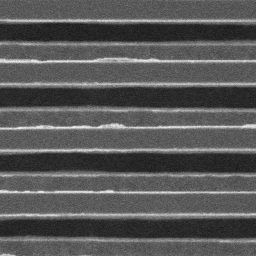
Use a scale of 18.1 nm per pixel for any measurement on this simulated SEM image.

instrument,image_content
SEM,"lines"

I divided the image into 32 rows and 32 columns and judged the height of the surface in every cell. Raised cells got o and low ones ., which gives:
oooooooooooooooooooooooooooooooo
oooooooooooooooooooooooooooooooo
oooooooooooooooooooooooooooooooo
................................
................................
ooooo..o..oo..oooo..............
oooooooooooooooooooooooooooooooo
oooooooooooooooooooooooooooooooo
oooooooooooooooooooooooooooooooo
oooooooooooooooooooooooooooooooo
oooooooooooooooooooooooooooooooo
................................
................................
................................
oooooooooooooooooooooooooooooooo
oooooooooooooooooooooooooooooooo
oooooooooooooooooooooooooooooooo
oooooooooooooooooooooooooooooooo
oooooooooooooooooooooooooooooooo
................................
................................
................................
oooooooooooooooooooooooooooooooo
oooooooooooooooooooooooooooooooo
oooooooooooooooooooooooooooooooo
oooooooooooooooooooooooooooooooo
oooooooooooooooooooooooooooooooo
................................
................................
................................
oooooooooooooooooooooooooooooooo
oooooooooooooooooooooooooooooooo